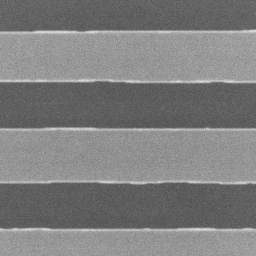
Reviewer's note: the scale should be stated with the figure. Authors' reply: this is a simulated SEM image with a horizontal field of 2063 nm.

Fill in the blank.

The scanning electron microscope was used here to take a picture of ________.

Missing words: lines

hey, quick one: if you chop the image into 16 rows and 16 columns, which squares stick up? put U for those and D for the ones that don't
DDDDDDDDDDDDDDDD
DDDDDDDDDDDDDDDD
UUUUUUUUUUUUUUUU
UUUUUUUUUUUUUUUU
UUUUUUUUUUUUUUUU
DDDDDDDDDDDDDDDD
DDDDDDDDDDDDDDDD
DDDDDDDDDDDDDDDD
UUUUUUUUUUUUUUUU
UUUUUUUUUUUUUUUU
UUUUUUUUUUUUUUUU
DDDDDDDDDDDDDDDD
DDDDDDDDDDDDDDDD
DDDDDDDDDDDDDDDD
UUUUUUUUUUUUUUUU
UUUUUUUUUUUUUUUU